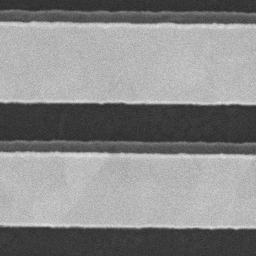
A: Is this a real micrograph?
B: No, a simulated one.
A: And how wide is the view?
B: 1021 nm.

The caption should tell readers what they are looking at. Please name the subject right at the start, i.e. lines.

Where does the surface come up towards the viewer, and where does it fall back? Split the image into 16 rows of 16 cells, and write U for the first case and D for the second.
DDDDDDDDDDDDDDDD
UUUUUUUUUUUUUUUU
UUUUUUUUUUUUUUUU
UUUUUUUUUUUUUUUU
UUUUUUUUUUUUUUUU
UUUUUUUUUUUUUUUU
DDDDDDDDDDDDUUUU
DDDDDDDDDDDDDDDD
DDDDDDDDDDDDDDDD
UUUUUUUUUUUUUUUU
UUUUUUUUUUUUUUUU
UUUUUUUUUUUUUUUU
UUUUUUUUUUUUUUUU
UUUUUUUUUUUUUUUU
DDDDDDDDDDDDDDDD
DDDDDDDDDDDDDDDD